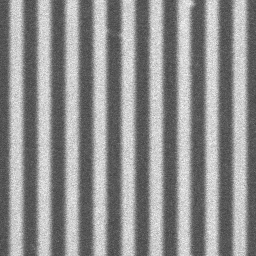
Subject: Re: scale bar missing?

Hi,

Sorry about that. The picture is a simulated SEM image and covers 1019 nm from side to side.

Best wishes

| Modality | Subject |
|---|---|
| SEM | parallel lines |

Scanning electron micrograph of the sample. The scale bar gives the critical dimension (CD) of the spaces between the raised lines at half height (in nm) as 62.3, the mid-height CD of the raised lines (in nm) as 50.8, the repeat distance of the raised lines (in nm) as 111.